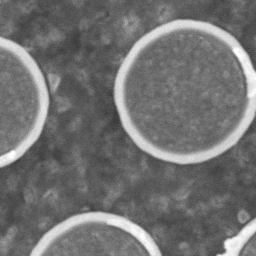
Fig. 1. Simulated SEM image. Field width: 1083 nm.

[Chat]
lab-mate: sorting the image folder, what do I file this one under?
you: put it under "raised bodies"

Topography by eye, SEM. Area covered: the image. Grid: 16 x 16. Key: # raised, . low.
................
................
.........#####..
#.......#######.
##......########
###....#########
###.....########
###.....#######.
##......#######.
#.........###...
................
................
................
................
....#####......#
...#######....##